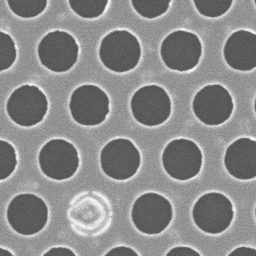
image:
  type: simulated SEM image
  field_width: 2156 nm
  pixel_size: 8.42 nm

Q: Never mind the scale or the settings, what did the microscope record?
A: a regular array of holes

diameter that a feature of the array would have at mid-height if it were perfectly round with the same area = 347 nm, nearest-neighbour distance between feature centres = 520 nanometres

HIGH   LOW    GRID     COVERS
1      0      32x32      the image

10000011100001111000011100000111
11000111100001111000011110001111
11111111111111111111111111111111
11111111111111111111111111111111
01111100011110000111100001111000
00111000001110000111000001110000
00111000001100000011000001110000
00111000001110000111000001110000
01111100011110000111100011111000
11111111111111111111111111111111
11111111111111111111111111111111
11000111100001111000011110000111
10000011100000110000011100000111
10000011100000110000011100000111
10000011100001111000011110000111
11000111110011111100111111001111
11111111111111111111111111111111
11111100111111001111110011111100
00111000011110000111100001110000
00111000001110000011000001110000
00111000001110000011000001110000
00111000011110000111100001111000
11111110111111111111111111111111
11111111111111111111111111111111
11000111111111111100111110001111
10000011111111111000011100000111
10000011111111110000001100000111
10000011111111111000011100000111
11000111111111111000011110001111
11111111111111111111111111111111
11111111111111111111111111111111
01111100011110000111100001111000